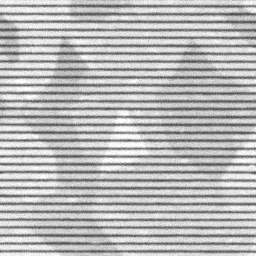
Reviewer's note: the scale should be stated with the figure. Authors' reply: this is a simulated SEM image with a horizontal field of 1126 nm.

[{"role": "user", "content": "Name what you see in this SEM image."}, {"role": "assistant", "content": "parallel lines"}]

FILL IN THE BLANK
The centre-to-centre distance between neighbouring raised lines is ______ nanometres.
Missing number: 34.8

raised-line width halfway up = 22.6 nm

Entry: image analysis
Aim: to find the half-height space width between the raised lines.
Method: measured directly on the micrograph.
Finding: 11.6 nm